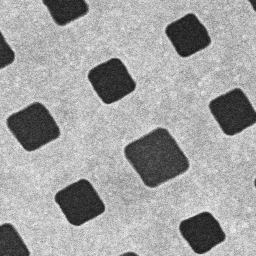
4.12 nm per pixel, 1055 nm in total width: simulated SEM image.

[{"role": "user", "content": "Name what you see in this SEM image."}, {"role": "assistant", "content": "holes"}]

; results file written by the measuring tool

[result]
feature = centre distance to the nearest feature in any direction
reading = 366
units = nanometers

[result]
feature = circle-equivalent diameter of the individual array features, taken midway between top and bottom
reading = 177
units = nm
